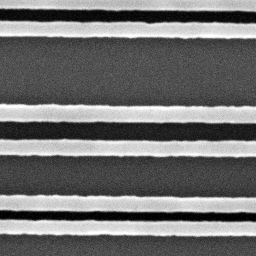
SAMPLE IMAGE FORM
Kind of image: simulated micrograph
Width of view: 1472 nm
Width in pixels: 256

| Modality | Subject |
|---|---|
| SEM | lines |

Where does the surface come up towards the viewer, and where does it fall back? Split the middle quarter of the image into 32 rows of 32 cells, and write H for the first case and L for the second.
LLLLLLLLLLLLLLLLLLLLLLLLLLLLLLLL
LLLLLLLLLLLLLLLLLLLLLLLLLLLLLLLL
LLLLLLLLLLLLLLLLLLLLLLLLLLLLLLLL
LLLLLLLLLLLLLLLLLLLLLLLLLLLLLLLL
LLLLLLLLLLLLLLLLLLLLLLLLLLLLLLLL
LLLLLLLLLLLLLLLLLLLLLLLLLLLLLLLL
LLLLLLLLLLLLLLLLLLLLLLLLLLLLLLLL
LLLLLLLLLLLLLLLLLLLLLLLLLLLLLLLL
LLLLLLLLLLLLLLLLLLLLLLLLLLLLLLLL
LLLLLLLLLLLLLLLLLLLLLLLLLLLLLLLL
LLLLLLLLLLLLLLLLLLLLLLLLLLLLLLLL
HHHHHHHHHHHHHHHHHHHHHHHHHHHHHHHH
HHHHHHHHHHHHHHHHHHHHHHHHHHHHHHHH
HHHHHHHHHHHHHHHHHHHHHHHHHHHHHHHH
LLLLLLLLLLLLLLLLLLLLLLLLHLLLLLLL
LLLLLLLLLLLLLLLLLLLLLLLLLLLLLLLL
LLLLLLLLLLLLLLLLLLLLLLLLLLLLLLLL
LLLLLLLLLLLLLLLLLLLLLLLLLLLLLLLL
LLLLLLLLLLLLLLLLLLLLLLLLLLLLLLLL
HHHHHHHHHHHHLHHHHHHHHLLLLLLHLLHL
HHHHHHHHHHHHHHHHHHHHHHHHHHHHHHHH
HHHHHHHHHHHHHHHHHHHHHHHHHHHHHHHH
HHHHHHHHHHHHHHHHHHHHHHHHHHHHHHHH
LLLLLLLLLLLLLLLLLLLLLLLLLLLLLLLL
LLLLLLLLLLLLLLLLLLLLLLLLLLLLLLLL
LLLLLLLLLLLLLLLLLLLLLLLLLLLLLLLL
LLLLLLLLLLLLLLLLLLLLLLLLLLLLLLLL
LLLLLLLLLLLLLLLLLLLLLLLLLLLLLLLL
LLLLLLLLLLLLLLLLLLLLLLLLLLLLLLLL
LLLLLLLLLLLLLLLLLLLLLLLLLLLLLLLL
LLLLLLLLLLLLLLLLLLLLLLLLLLLLLLLL
LLLLLLLLLLLLLLLLLLLLLLLLLLLLLLLL